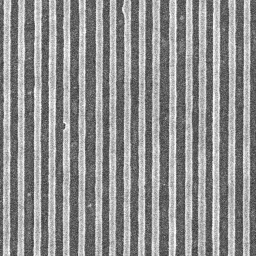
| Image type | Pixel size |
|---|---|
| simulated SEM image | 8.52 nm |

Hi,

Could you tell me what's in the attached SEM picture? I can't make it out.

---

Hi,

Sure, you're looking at parallel lines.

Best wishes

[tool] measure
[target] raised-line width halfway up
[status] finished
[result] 5.87 px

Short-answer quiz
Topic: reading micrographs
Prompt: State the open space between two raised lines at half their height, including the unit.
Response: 74.5 nm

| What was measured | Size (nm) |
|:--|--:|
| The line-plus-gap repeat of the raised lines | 128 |